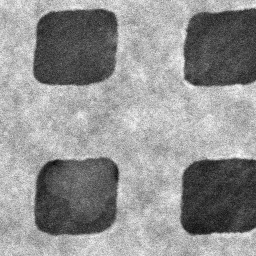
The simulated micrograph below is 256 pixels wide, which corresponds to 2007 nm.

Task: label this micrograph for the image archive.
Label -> holes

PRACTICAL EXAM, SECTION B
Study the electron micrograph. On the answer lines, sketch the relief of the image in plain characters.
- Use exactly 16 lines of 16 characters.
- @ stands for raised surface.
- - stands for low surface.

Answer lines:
@@@@@@@@@@@@@@@@
@@-----@@@@@----
@@-----@@@@@----
@@-----@@@@-----
@@-----@@@@@----
@@@@@@@@@@@@@@@@
@@@@@@@@@@@@@@@@
@@@@@@@@@@@@@@@@
@@@@@@@@@@@@@@@@
@@@@@@@@@@@@@@@@
@@@----@@@@@----
@@-----@@@@-----
@@-----@@@@-----
@@-----@@@@-----
@@@---@@@@@@---@
@@@@@@@@@@@@@@@@